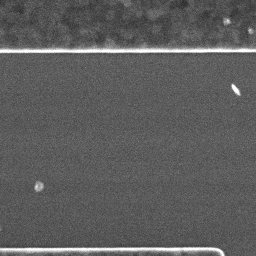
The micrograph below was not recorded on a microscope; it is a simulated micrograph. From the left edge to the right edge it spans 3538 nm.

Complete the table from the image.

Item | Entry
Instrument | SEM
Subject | wiring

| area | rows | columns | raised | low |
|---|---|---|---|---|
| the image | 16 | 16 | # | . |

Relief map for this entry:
################
################
################
................
................
................
................
................
................
................
................
................
................
................
................
................